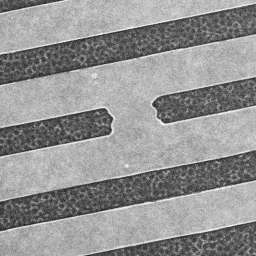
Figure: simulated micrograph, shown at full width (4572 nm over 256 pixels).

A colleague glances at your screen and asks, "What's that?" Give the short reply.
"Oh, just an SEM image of one or a few lines or trenches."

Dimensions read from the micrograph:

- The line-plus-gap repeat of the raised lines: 1270 nanometres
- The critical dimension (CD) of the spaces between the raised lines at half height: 534 nanometres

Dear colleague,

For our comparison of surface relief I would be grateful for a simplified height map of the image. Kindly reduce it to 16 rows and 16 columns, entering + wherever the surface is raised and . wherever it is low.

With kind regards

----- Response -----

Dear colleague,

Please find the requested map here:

..++++++++++++..
++++++++++......
+++++.........++
.........+++++++
....++++++++++++
+++++++++++++...
++++++++++......
++.....+++..++++
.......+++++++++
..+++++++++++++.
++++++++++......
+++++..........+
..........++++++
.....+++++++++++
+++++++++++++...
+++++++.........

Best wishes